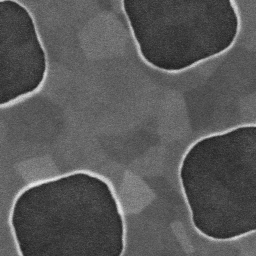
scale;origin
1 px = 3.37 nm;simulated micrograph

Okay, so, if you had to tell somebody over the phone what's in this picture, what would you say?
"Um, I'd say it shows holes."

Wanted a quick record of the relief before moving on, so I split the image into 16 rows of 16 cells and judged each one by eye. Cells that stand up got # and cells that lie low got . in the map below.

.#######.......#
..######.......#
..#######......#
...######....###
...#############
..##############
################
################
#############...
############....
###########.....
##.....####.....
#......#####....
#.......####....
#.......#####...
#.......########